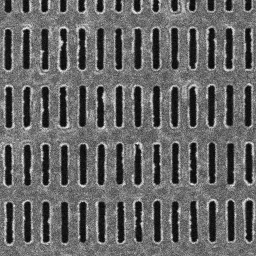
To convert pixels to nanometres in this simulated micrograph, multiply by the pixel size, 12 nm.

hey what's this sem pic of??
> a regular array of holes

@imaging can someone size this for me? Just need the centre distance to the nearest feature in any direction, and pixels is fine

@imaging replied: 18.2